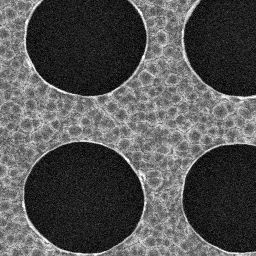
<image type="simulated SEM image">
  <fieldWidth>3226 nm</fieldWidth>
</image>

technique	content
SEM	holes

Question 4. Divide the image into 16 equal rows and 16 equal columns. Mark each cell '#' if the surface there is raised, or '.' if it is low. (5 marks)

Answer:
##......####....
##.......###....
##.......##.....
##.......###....
##......####....
####...######...
################
################
################
###....######...
##......####....
##.......###....
#........##.....
##.......###....
##......####....
####...#######..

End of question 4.